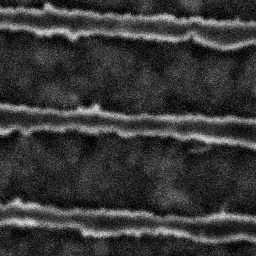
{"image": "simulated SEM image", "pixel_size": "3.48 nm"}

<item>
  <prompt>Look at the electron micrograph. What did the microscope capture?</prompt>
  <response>one or a few lines or trenches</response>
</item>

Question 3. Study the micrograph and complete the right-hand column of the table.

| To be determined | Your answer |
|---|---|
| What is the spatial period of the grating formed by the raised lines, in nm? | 341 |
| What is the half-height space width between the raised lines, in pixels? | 77.8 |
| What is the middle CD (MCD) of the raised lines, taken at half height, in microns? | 0.0712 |